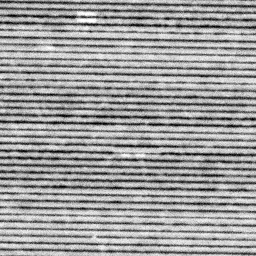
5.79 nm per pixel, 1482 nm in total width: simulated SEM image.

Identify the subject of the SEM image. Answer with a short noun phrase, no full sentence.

parallel lines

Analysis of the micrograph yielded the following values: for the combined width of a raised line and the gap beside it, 41 nm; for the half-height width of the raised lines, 25.3 nm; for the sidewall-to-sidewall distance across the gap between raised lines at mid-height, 0.0152 um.